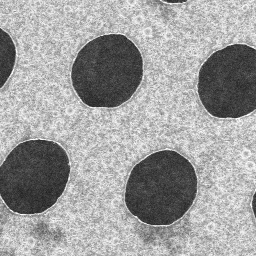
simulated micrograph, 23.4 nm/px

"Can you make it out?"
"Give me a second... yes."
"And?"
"holes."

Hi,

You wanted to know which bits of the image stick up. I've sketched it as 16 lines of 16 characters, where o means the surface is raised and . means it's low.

oooooooooooooooo
oooooooooooooooo
.ooooo..oooooooo
.oooo....oooo...
.ooo.....ooo....
ooooo....ooo....
ooooo...ooooo...
oooooooooooooooo
oooooooooooooooo
o...oooooo.ooooo
....oooo....oooo
....oooo....oooo
....oooo....oooo
oooooooo...ooooo
oooooooooooooooo
oooooooooooooooo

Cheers